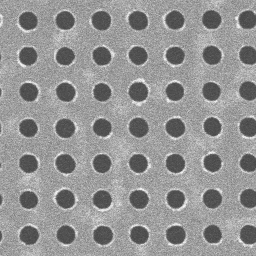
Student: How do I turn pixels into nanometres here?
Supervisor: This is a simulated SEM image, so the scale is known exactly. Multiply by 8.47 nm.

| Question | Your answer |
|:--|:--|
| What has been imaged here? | a regular array of holes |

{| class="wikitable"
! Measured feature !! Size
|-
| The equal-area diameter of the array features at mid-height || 161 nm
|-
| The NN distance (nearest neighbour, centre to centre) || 302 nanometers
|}